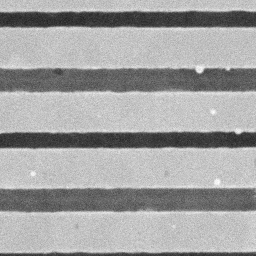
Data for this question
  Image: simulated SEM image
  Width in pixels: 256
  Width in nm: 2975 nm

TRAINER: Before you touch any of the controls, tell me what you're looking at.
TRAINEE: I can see lines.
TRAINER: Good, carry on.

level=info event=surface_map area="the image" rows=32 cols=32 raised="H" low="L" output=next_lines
HHHHHHHHHHHHHHHHHHHHHHHHHHHHHHHH
LLLLLLLLLLLLLLLLLLLLLLLLLLLLLLLL
LLLLLLLLLLLLLLLLLLLLLLLLLLLLLLLL
HHHLLLHHHHHHLLHHHLLLHLLLLLHHLLLL
HHHHHHHHHHHHHHHHHHHHHHHHHHHHHHHH
HHHHHHHHHHHHHHHHHHHHHHHHHHHHHHHH
HHHHHHHHHHHHHHHHHHHHHHHHHHHHHHHH
HHHHHHHHHHHHHHHHHHHHHHHHHHHHHHHH
HHHHHLLLLHHHHHHLHHHHLHHHHHLHHLLL
LLLLLLLLLLLLLLLLLLLLLLLLLLLLLLLL
LLLLLLLLLLLLLLLLLLLLLLLLLLLLLLLL
LLLLLLLLLLLLLLLLLLLLLLLLLLLLLLLL
HHHHHHHHHHHHHHHHHHHHHHHHHHHHHHHH
HHHHHHHHHHHHHHHHHHHHHHHHHHHHHHHH
HHHHHHHHHHHHHHHHHHHHHHHHHHHHHHHH
HHHHHHHHHHHHHHHHHHHHHHHHHHHHHHHH
HHLLLLHHHHHLLLLLHLLLLLLLLLLLLHLL
LLLLLLLLLLLLLLLLLLLLLLLLLLLLLLLL
LLLLLLLLLLLLLLLLLLLLLLLLLLLLLLLL
HHHHHHHHHHHHHHHHHHHHHHHHHHHHHHHH
HHHHHHHHHHHHHHHHHHHHHHHHHHHHHHHH
HHHHHHHHHHHHHHHHHHHHHHHHHHHHHHHH
HHHHHHHHHHHHHHHHHHHHHHHHHHHHHHHH
HHHHHHHHHHHLHHHLHHLLLLLLLLLLLLLL
LLLLLLLLLLLLLLLLLLLLLLLLLLLLLLLL
LLLLLLLLLLLLLLLLLLLLLLLLLLLLLLLL
LLLLLLLLLLLLLLLLLLLLLLLLLLLLLLLH
HHHHHHHHHHHHHHHHHHHHHHHHHHHHHHHH
HHHHHHHHHHHHHHHHHHHHHHHHHHHHHHHH
HHHHHHHHHHHHHHHHHHHHHHHHHHHHHHHH
HHHHHHHHHHHHHHHHHHHHHHHHHHHHHHHH
HHHHHHHHHHHHHHHHHHHHHLHHHLLLHLLL